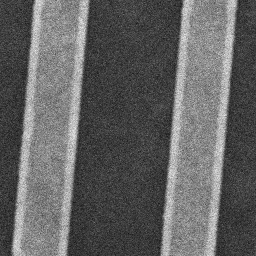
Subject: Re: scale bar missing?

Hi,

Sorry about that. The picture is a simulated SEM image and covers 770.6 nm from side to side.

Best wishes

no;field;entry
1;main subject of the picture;one or a few lines or trenches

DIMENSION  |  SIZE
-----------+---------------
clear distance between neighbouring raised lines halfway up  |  306 nanometres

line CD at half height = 45.9 px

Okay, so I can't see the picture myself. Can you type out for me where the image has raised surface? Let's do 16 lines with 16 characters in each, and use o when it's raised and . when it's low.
..ooo.......ooo.
..ooo.......oo..
..ooo......ooo..
..ooo......ooo..
..ooo......ooo..
..ooo......ooo..
..ooo......ooo..
..ooo......ooo..
..ooo......ooo..
..oo.......ooo..
.ooo.......ooo..
.ooo.......ooo..
.ooo.......oo...
.ooo......ooo...
.ooo......ooo...
.ooo......ooo...